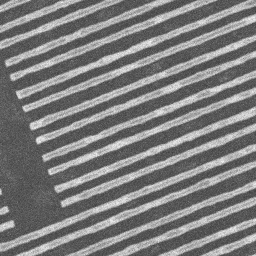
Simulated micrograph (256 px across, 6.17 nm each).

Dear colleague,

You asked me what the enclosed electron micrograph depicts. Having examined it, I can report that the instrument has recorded parallel lines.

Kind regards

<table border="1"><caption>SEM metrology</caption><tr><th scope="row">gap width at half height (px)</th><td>12.3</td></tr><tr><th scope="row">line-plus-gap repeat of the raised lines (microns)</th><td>0.105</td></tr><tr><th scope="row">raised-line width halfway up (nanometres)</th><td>28.7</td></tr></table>